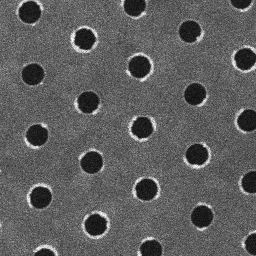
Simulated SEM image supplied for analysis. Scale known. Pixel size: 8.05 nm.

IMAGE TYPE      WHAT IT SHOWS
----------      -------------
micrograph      a regular array of holes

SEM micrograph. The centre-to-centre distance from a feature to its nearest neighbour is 490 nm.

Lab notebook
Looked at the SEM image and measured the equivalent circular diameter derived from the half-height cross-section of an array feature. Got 180 nm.